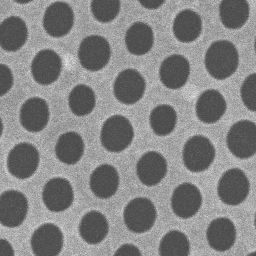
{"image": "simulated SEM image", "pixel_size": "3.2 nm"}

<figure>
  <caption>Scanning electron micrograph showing a regular array of holes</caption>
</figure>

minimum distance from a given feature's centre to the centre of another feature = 153 nm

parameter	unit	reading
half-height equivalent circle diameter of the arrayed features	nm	108